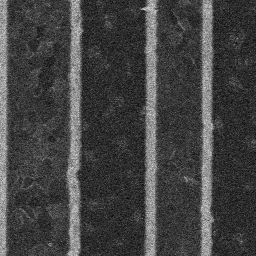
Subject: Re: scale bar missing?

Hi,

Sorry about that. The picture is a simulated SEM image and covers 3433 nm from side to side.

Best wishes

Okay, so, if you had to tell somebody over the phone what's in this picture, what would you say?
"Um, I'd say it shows one or a few lines or trenches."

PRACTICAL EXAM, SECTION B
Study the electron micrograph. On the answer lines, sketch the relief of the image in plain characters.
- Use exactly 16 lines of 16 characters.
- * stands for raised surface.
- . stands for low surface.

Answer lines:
*****....****...
*****.....***...
*****....****...
*****....****...
*****.....***...
*****.....***...
*****.....***...
*****....****...
*****....****...
*****....****...
*****....****...
*****....****...
*****....****...
*****....****...
*****....****...
*****....****...